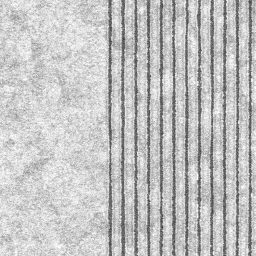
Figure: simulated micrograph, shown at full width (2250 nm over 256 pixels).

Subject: parallel lines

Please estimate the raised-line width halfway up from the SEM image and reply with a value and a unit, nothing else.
8.75 px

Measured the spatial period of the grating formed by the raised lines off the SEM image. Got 112 nm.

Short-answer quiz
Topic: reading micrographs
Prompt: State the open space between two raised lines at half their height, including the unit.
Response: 30.8 nanometres